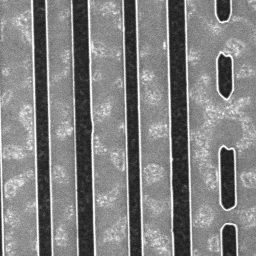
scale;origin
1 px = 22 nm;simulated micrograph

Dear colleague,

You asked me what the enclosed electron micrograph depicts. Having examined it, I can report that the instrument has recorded parallel lines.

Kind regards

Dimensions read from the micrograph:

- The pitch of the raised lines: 1010 nm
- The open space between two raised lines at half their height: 661 nanometers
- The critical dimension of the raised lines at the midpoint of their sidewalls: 340 nm